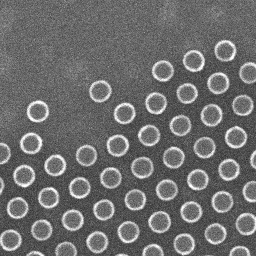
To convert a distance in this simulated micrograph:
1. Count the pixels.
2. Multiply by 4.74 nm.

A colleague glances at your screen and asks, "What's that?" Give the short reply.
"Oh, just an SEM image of a regular array of raised bodies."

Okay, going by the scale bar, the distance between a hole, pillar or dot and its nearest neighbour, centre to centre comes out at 32.7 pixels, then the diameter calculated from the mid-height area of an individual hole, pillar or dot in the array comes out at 20.9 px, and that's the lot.